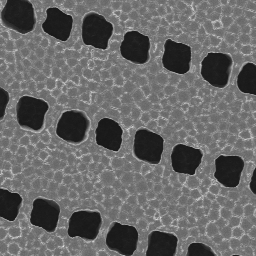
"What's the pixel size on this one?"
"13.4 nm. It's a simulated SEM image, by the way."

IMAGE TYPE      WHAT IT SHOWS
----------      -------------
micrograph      a regular array of holes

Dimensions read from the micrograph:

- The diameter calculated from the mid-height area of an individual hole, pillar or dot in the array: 0.415 micrometres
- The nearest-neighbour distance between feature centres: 543 nm